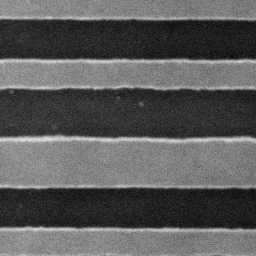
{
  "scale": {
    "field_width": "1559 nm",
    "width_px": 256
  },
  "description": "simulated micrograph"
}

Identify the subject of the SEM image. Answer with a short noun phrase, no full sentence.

lines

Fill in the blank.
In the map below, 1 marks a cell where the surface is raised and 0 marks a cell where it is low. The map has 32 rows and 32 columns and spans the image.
11111111111111111111111111111111
11111111111111111111111111111111
00000000000000000000000000000000
00000000000000000000000000000000
00000000000000000000000000000000
00000000000000000000000000000000
00000000000000000000000000000000
00000000000000000000000000000000
11111111111111111111111111111111
11111111111111111111111111111111
11111111111111111111111111111111
00000000000000000000000000000000
00000000000000000000000000000000
00000000000000000000000000000000
00000000000000000000000000000000
00000000000000000000000000000000
00000000000000000000000000000000
00000101111100011000000000000000
11111111111111111111111111111111
11111111111111111111111111111111
11111111111111111111111111111111
11111111111111111111111111111111
11111111111111111111111111111111
00000000000000000000000000000000
00000000000000000000000000000000
00000000000000000000000000000000
00000000000000000000000000000000
00000000000000000000000000000000
00000000000000000000000000000000
11111111111111111111111111111111
11111111111111111111111111111111
11111111111111111111111111111111